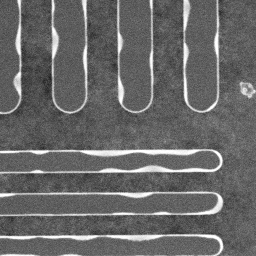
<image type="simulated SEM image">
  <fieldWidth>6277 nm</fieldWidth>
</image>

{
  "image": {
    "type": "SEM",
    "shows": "groups of lines, slits or small figures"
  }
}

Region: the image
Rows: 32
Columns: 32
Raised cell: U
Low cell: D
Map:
UUDDDDDUUUUDDDDUUUUDDDDUUUUDDDDD
UUUDDDDUUUUDDDDUUUUDDDDUUUUDDDDD
UUUDDDDUUUUDDDDUUUUDDDDUUUUDDDDD
UUUDDDDUUUUDDDDUUUUDDDDUUUUDDDDD
UUDDDDDUUUUDDDDUUUUDDDDUUUUDDDDD
UUDDDDDUUUUDDDDUUUUDDDDUUUUDDDDD
UUDDDDDUUUUDDDDUUUUDDDDUUUUDDDDD
UUUDDDDUUUUDDDDUUUUDDDDUUUUDDDDD
UUUDDDDUUUUDDDDUUUUDDDDUUUUDDDDD
UUDDDDDUUUUDDDDUUUUDDDDUUUUDDDDD
UUDDDDDUUUUDDDDUUUUDDDDUUUUDDDDD
UUUDDDDUUUUDDDDUUUUDDDDUUUUDDDDD
UUUDDDDUUUUDDDDUUUUDDDDUUUUDDDDD
UUDDDDDUUUDDDDDDUUDDDDDDUUDDDDDD
DDDDDDDDDDDDDDDDDDDDDDDDDDDDDDDD
DDDDDDDDDDDDDDDDDDDDDDDDDDDDDDDD
DDDDDDDDDDDDDDDDDDDDDDDDDDDDDDDD
DDDDDDDDDDDDDDDDDDDDDDDDDDDDDDDD
DDDDDDDDDDDDDDDDDDDDDDDDDDDDDDDD
UUUUUUUUUUUUUUUUUUUUUUUUUUUDDDDD
UUUUUUUUUUUUUUUUUUUUUUUUUUUUDDDD
UDDDDDDDDDDDDDDDDDDDDDDDDDDDDDDD
DDDDDDDDDDDDDDDDDDDDDDDDDDDDDDDD
DDDDDDDDDDDDDDDDDDDDDDDDDDDDDDDD
UUUUUUUUUUUUUUUUUUUUUUUUUUUDDDDD
UUUUUUUUUUUUUUUUUUUUUUUUUUUDDDDD
UUUUUUUUUUUUUUUUUUUUUUUUUUDDDDDD
DDDDDDDDDDDDDDDDDDDDDDDDDDDDDDDD
DDDDDDDDDDDDDDDDDDDDDDDDDDDDDDDD
DDDDDDDDDDDDDDDDDDDDUUUUUUDDDDDD
UUUUUUUUUUUUUUUUUUUUUUUUUUUUDDDD
UUUUUUUUUUUUUUUUUUUUUUUUUUUDDDDD